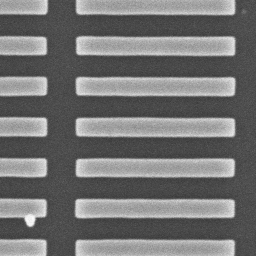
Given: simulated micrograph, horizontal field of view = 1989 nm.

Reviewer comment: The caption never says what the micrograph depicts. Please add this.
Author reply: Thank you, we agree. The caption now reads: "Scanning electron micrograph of groups of lines, slits or small figures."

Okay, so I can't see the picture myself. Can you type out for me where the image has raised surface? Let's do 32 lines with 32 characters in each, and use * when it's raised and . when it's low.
******....*******************...
******....*******************...
................................
................................
................................
******....*******************...
******....*******************...
................................
................................
................................
******....*******************...
******....*******************...
................................
................................
................................
******....*******************...
******....*******************...
................................
................................
................................
******....*******************...
******....*******************...
................................
................................
................................
******...********************...
******...********************...
...*............................
................................
................................
******...********************...
******...********************...